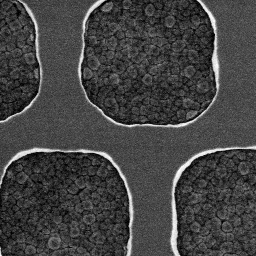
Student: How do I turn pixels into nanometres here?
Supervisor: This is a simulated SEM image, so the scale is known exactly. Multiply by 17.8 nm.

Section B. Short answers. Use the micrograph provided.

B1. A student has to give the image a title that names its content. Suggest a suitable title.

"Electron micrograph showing holes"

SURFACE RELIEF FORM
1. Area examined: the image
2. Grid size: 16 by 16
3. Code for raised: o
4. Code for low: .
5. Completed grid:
..oooo.......ooo
..ooo........ooo
..ooo........ooo
..ooo........ooo
..ooo........ooo
..ooo.........oo
..oooo.......ooo
ooooooo.....oooo
oooooooooooooooo
oo...ooooooooo..
.......ooooo....
........ooo.....
........ooo.....
........ooo.....
........ooo.....
........ooo.....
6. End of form